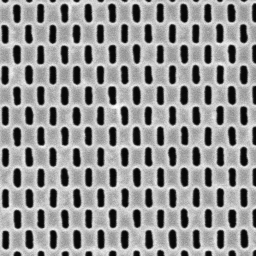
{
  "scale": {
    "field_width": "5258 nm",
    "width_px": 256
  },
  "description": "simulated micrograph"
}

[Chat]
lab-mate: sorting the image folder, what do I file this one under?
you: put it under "a regular array of holes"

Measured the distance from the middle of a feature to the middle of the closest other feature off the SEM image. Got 0.48 micrometres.